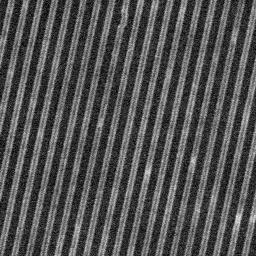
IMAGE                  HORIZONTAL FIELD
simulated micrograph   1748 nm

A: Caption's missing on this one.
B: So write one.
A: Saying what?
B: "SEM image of parallel lines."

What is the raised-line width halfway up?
35.1 nanometres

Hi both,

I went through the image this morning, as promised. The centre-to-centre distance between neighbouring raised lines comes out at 96.2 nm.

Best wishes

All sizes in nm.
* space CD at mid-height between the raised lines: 59.2